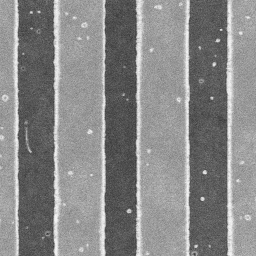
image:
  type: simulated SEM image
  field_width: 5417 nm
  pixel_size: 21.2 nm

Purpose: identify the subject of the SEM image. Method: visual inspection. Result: lines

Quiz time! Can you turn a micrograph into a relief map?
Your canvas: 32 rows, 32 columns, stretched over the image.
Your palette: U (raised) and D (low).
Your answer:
UUDDDDDUUUUUUDDDDUUUUUUUDDDDDUUU
UUDDDDDUUUUUUDDDDUUUUUUUDDDDDUUU
UUDDDDDUUUUUUDDDDUUUUUUUDDDDDUUU
UUDDDDDUUUUUUDDDDUUUUUUUDDDDDUUU
UUDDDDDUUUUUUDDDDUUUUUUUDDDDDUUU
UUDDDDDUUUUUUDDDDUUUUUUUDDDDDUUU
UUDDDDDUUUUUUDDDDUUUUUUUDDDDDUUU
UUDDDDDUUUUUUDDDDUUUUUUUDDDDDUUU
UUDDDDDUUUUUUDDDDUUUUUUUDDDDDUUU
UUDDDDDUUUUUUDDDDUUUUUUUDDDDDUUU
UUDDDDDUUUUUUDDDDUUUUUUUDDDDDUUU
UUDDDDDUUUUUUDDDDUUUUUUUDDDDDUUU
UUDDDDDUUUUUUDDDDUUUUUUUDDDDDUUU
UUDDDDDUUUUUUDDDDUUUUUUUDDDDDUUU
UUDDDDDUUUUUUDDDDUUUUUUUDDDDDUUU
UUDDDDDUUUUUUDDDDUUUUUUUDDDDDUUU
UUDDDDDUUUUUUDDDDUUUUUUUDDDDDUUU
UUDDDDDUUUUUUDDDDUUUUUUUDDDDDUUU
UUDDDDDUUUUUUDDDDUUUUUUUDDDDDUUU
UUDDDDDUUUUUUDDDDUUUUUUUDDDDDUUU
UUDDDDDUUUUUUDDDDUUUUUUUDDDDDUUU
UUDDDDDUUUUUUDDDDUUUUUUUDDDDDUUU
UUDDDDDUUUUUUDDDDUUUUUUUDDDDDUUU
UUDDDDDUUUUUUDDDDUUUUUUUDDDDDUUU
UUDDDDDUUUUUUDDDDUUUUUUUDDDDDUUU
UUDDDDDUUUUUUDDDDUUUUUUUDDDDDUUU
UUDDDDDUUUUUUDDDDUUUUUUUDDDDDUUU
UUDDDDDUUUUUUDDDDUUUUUUUDDDDDUUU
UUDDDDDUUUUUUDDDDUUUUUUUDDDDDUUU
UUDDDDDUUUUUUDDDDUUUUUUUDDDDDUUU
UUDDDDDUUUUUUDDDDUUUUUUUDDDDDUUU
UUDDDDDUUUUUUDDDDUUUUUUUDDDDDUUU